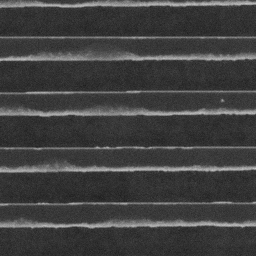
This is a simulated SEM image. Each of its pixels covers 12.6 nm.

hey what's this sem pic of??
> lines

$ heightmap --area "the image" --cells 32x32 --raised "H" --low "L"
HHHHHHHHHHHHHHHHHHHHHHHHHHHHHLLL
LLLLLLLLLLLLLLLLLLLLLLLLLLLLLLLL
LLLLLLLLLLLLLLLLLLLLLLLLLLLLLLLL
LLLLLLLLLLLLLLLLLLLLLLLLLLLLLLLL
LLLLLLLLLLLLLLLLLLLLLLLLLLLLLLLL
HHHHHHHHHHHHHHHHHHHHHHHHHHHHHHHH
HHHHHHHHHHHHHHHHHHHHHHHHHHHHHHHH
LLLLLLLLLLLLLLLLLLLLLLLLLLLLLLLL
LLLLLLLLLLLLLLLLLLLLLLLLLLLLLLLL
LLLLLLLLLLLLLLLLLLLLLLLLLLLLLLLL
LLLLLLLLLLLLLLLLLLLLLLLLLLLLLLLL
LLLLLLLLLLLLLLLHHHHHHHHHHHHHHHHH
HHHHHHHHHHHHHHHHHHHHHHHHHHHHHHHH
HHHHHHHHHHHHHHHHHHHHHHHHHHHHHHHH
LLLLLLLLLLLLLLLLLLLLLLLLLLLLLLLL
LLLLLLLLLLLLLLLLLLLLLLLLLLLLLLLL
LLLLLLLLLLLLLLLLLLLLLLLLLLLLLLLL
LLLLLLLLLLLLLLLLLLLLLLLLLLLLLLLL
LLLLLLLLLLLLHHHHHHHHHHHHHHHHHHHH
HHHHHHHHHHHHHHHHHHHHHHHHHHHHHHHH
HHHHHHHHHHHHHHHHHHHHHHHHHHHHHHHH
LLLLLLLLLLLLLLLLLLLLLLLLLLLLLLLL
LLLLLLLLLLLLLLLLLLLLLLLLLLLLLLLL
LLLLLLLLLLLLLLLLLLLLLLLLLLLLLLLL
LLLLLLLLLLLLLLLLLLLLLLLLLLLLLLLL
LLLLHHLLLHHHHHHHHHHHHHHHHHHHHHHH
HHHHHHHHHHHHHHHHHHHHHHHHHHHHHHHH
HHHHHHHHHHHHHHHHHHHHHHHHHHHHHHHH
LLLLLLLLLLLLLLLLLLLLLLLLLLLLLLLL
LLLLLLLLLLLLLLLLLLLLLLLLLLLLLLLL
LLLLLLLLLLLLLLLLLLLLLLLLLLLLLLLL
LLLLLLLLLLLLLLLLLLLLLLLLLLLLLLLL